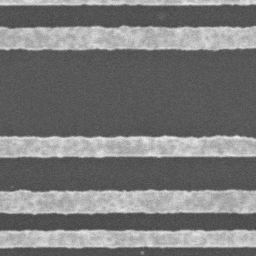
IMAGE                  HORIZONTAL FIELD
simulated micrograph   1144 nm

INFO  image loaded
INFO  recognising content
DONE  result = lines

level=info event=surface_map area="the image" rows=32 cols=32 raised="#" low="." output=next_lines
##########.###..############.###
................................
................................
#...##.######..######.########.#
################################
################################
................................
................................
................................
................................
................................
................................
................................
................................
................................
................................
................................
################################
################################
###.####..###......#............
................................
................................
................................
................................
################################
################################
.#####.##.####....##.........##.
................................
................................
################################
################################
................................